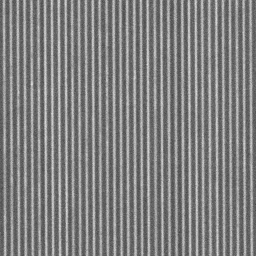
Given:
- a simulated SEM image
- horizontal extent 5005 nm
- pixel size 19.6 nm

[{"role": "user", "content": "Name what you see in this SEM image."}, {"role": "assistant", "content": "parallel lines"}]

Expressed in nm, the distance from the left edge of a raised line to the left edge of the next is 134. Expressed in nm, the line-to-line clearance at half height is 100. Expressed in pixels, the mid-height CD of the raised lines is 1.75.